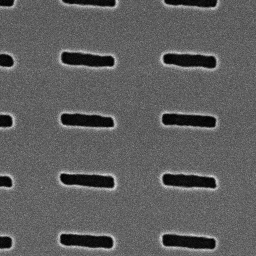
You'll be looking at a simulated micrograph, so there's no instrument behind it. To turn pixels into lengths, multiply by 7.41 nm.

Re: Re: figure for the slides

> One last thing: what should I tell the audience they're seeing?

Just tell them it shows a regular array of holes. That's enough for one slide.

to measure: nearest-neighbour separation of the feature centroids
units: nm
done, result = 446